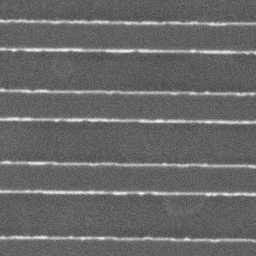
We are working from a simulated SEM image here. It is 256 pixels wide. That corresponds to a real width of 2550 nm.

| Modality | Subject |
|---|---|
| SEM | lines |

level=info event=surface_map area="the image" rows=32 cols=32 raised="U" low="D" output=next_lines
DDDDDDDDDDDDDDDDDDDDDDDDDDDDDDDD
DDDDDDDDDDDDDDDDDDDDDDDDDDDDDDDD
DDDDDDDDDDDDDDDDDDDDDDDDDDDDDDDD
UUUUUUUUUUUUUUUUUUUUUUUUUUUUUUUU
UUUUUUUUUUUUUUUUUUUUUUUUUUUUUUUU
UUUUUUUUUUUUUUUUUUUUUUUUUUUUUUUU
DDDDDDDDDDDDDDDDDDDDDDDDDUUUUUUU
DDDDDDDDDDDDDDDDDDDDDDDDDDDDDDDD
DDDDDDDDDDDDDDDDDDDDDDDDDDDDDDDD
DDDDDDDDDDDDDDDDDDDDDDDDDDDDDDDD
DDDDDDDDDDDDDDDDDDDDDDDDDDDDDDDD
UUUUUUUUUUUUUUUUDDDDDDDDDDDDDDDD
UUUUUUUUUUUUUUUUUUUUUUUUUUUUUUUU
UUUUUUUUUUUUUUUUUUUUUUUUUUUUUUUU
UUUUUUUUUUUUUUUUUUUUUUUUUUUUUUUU
DDDDDDDDDDDDDDDDDDDDDDDDDDDDDDDD
DDDDDDDDDDDDDDDDDDDDDDDDDDDDDDDD
DDDDDDDDDDDDDDDDDDDDDDDDDDDDDDDD
DDDDDDDDDDDDDDDDDDDDDDDDDDDDDDDD
DDDDDDDDDDDDDDDDDDDDDDDDDDDDDDDD
UUUUUUUDDDDDDDDDDDDDDDDDDDDDDDDD
UUUUUUUUUUUUUUUUUUUUUUUUUUUUUUUU
UUUUUUUUUUUUUUUUUUUUUUUUUUUUUUUU
UUUUUUUUUUUUUUUUUUUUUUUUUUUUUUUU
DDDDDDDDDDDDDDDDDDDDDDDDDDDDDDDD
DDDDDDDDDDDDDDDDDDDDDDDDDDDDDDDD
DDDDDDDDDDDDDDDDDDDDDDDDDDDDDDDD
DDDDDDDDDDDDDDDDDDDDDDDDDDDDDDDD
DDDDDDDDDDDDDDDDDDDDDDDDDDDDDDDD
DDDDDDDDDDDDDDDDDDDDDDDDDDDDDDDD
UUUUUUUUUUUUUUUUUUUUUUUUUUUUUUUU
UUUUUUUUUUUUUUUUUUUUUUUUUUUUUUUU